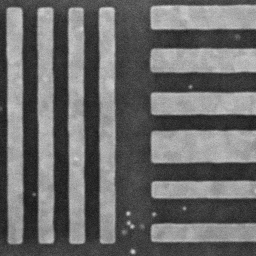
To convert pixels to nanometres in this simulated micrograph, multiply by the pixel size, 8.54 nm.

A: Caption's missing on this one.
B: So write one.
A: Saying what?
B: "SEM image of groups of lines, slits or small figures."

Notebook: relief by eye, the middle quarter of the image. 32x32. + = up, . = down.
.++++....+++..........++++++++++
.++++....++++.........++++++++++
.++++....++++...................
.++++....++++...................
.++++....+++....................
.++++....+++....................
.++++....+++....................
.++++....+++..........++++++.+++
.++++....++++.........++++++++++
.++++....++++.........++++++++++
.++++....++++.........++++++++++
.++++....++++.........++++++++++
.++++....++++...................
.++++....++++...................
.++++....++++...................
.++++....++++...................
.++++....++++...................
.++++....++++.........++++++++++
..+++....++++.........++++++++++
..+++....++++.........++++++++++
.++++....++++.........++++++++++
.++++....++++.........++++++++++
.++++....++++.........++++++++++
..+++....++++.........++++++++++
..+++....++++.........++++++++++
..+++....++++...................
..+++....++++...................
..+++....++++...................
..+++....+++....................
.++++....+++....................
.++++....+++..........++++++++++
.++++....++++.........++++++++++